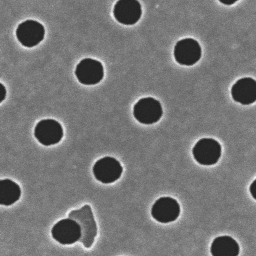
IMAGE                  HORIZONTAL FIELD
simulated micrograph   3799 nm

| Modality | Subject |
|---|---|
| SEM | a regular array of holes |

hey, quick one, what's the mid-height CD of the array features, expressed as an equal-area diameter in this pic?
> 419 nanometres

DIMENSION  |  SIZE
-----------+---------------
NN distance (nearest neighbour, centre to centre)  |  1050 nm